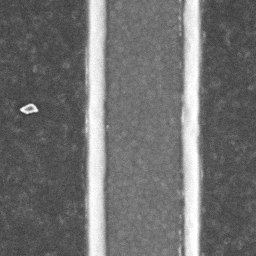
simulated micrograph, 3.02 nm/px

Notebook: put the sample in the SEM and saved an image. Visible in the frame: one or a few lines or trenches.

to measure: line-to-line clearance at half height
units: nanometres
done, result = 290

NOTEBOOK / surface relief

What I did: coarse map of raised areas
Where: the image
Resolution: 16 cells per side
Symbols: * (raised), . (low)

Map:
******......****
******......****
******......****
******......****
******......****
******......****
******......****
******......****
******......****
******......****
******......****
******......****
******......****
******......****
******......****
******......****